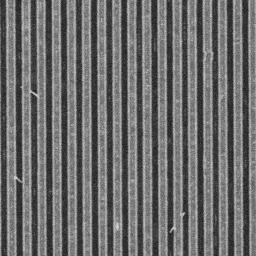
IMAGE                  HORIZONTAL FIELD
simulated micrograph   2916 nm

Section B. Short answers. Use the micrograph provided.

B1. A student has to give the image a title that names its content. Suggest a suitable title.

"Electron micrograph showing parallel lines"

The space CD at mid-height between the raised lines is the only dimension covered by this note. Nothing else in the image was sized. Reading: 84 nanometers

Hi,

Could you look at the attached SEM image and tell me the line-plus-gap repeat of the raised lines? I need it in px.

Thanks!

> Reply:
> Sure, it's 15.1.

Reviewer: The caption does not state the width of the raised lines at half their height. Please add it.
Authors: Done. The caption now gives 7.25 px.